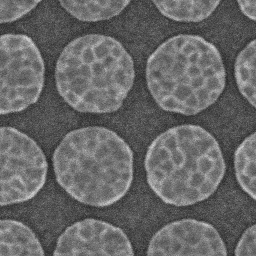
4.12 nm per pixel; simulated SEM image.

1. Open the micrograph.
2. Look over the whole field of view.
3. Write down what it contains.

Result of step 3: raised bodies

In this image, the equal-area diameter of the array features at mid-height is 0.323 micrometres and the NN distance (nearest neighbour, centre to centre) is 374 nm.